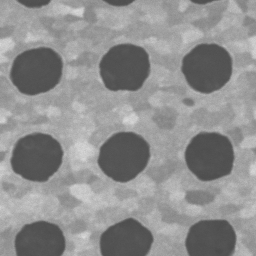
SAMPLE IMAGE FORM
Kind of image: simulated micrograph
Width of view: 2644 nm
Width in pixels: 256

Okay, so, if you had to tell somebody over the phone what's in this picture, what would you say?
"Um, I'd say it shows holes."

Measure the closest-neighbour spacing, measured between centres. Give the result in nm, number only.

887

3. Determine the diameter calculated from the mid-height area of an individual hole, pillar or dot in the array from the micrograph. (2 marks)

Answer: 521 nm